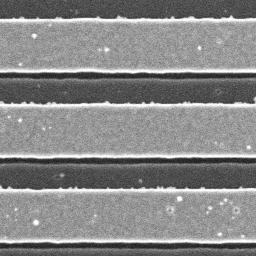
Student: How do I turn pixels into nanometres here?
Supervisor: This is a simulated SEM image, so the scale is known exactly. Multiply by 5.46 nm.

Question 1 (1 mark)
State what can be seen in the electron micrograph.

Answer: lines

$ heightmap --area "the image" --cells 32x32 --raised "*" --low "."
................................
................................
********************************
********************************
********************************
********************************
********************************
********************************
********************************
................................
................................
................................
................................
********************************
********************************
********************************
********************************
********************************
********************************
********************************
................................
................................
................................
................................
********************************
********************************
********************************
********************************
********************************
********************************
................................
................................